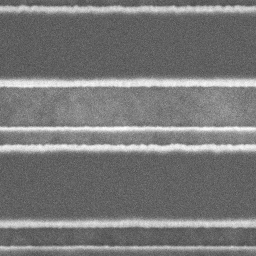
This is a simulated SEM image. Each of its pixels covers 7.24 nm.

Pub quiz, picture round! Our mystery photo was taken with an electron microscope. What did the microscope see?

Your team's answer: lines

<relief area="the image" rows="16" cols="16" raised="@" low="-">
@@@@@@@@@@@@@@@@
@@@@@@@@@@@@@@@@
@@@@@@@@@@@@@@@@
@@@@@@@@@@@@@@@@
@@@@@@@@@@@@@@@@
----------------
----------------
----------------
----------------
@@@@@@@@@@@@@@@@
@@@@@@@@@@@@@@@@
@@@@@@@@@@@@@@@@
@@@@@@@@@@@@@@@@
@@@@@@@@@@@@@@@@
----------------
----------------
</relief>